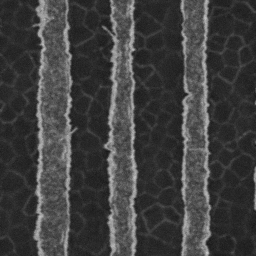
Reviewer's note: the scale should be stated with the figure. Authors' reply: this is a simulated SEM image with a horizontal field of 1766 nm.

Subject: one or a few lines or trenches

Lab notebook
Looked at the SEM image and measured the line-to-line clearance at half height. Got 0.331 um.